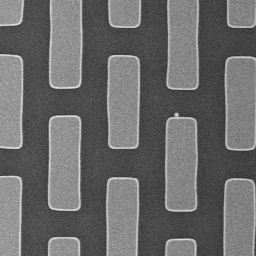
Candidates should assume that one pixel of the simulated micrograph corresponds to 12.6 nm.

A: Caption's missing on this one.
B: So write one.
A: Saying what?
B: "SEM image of groups of lines, slits or small figures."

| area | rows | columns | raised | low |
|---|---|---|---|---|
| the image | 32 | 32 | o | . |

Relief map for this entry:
ooo...oooo....ooo....oooo...oooo
ooo...oooo....ooo....oooo...oooo
ooo...oooo....ooo....oooo...oooo
......oooo...........oooo.......
......oooo...........oooo.......
......oooo...........oooo.......
......oooo...........oooo.......
ooo...oooo....ooo....oooo...oooo
ooo...oooo....ooo....oooo...oooo
ooo...oooo....ooo....oooo...oooo
ooo...oooo....ooo....oooo...oooo
ooo...........ooo...........oooo
ooo...........ooo...........oooo
ooo...........ooo...........oooo
ooo...........ooo...........oooo
ooo...oooo....ooo....oooo...oooo
ooo...oooo....ooo....oooo...oooo
ooo...oooo....ooo....oooo...oooo
oo....oooo....ooo....oooo....ooo
......oooo...........oooo.......
......oooo...........oooo.......
......oooo...........oooo.......
oo....oooo....ooo....ooo.....oo.
ooo...oooo...oooo....ooo....oooo
ooo...oooo...oooo....oooo...oooo
ooo...oooo...oooo....oooo...oooo
ooo..........oooo...........oooo
ooo..........oooo...........oooo
ooo..........oooo...........oooo
oo...........oooo...........oooo
oo....oooo...oooo....ooo....oooo
oo....oooo...oooo....ooo....oooo